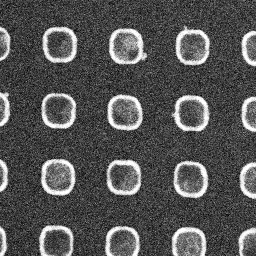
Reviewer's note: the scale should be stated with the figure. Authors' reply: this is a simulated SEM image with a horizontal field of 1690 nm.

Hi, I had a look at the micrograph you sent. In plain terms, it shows a regular array of raised bodies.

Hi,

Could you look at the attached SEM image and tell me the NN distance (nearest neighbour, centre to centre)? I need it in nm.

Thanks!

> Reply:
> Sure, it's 435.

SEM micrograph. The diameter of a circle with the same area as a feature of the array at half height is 34.2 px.